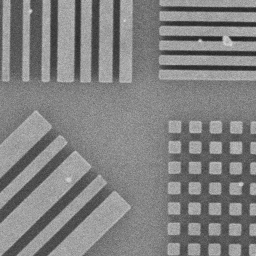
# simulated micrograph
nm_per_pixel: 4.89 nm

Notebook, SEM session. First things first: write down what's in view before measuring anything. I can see groups of lines, slits or small figures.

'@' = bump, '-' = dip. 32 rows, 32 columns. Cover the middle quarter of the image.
@@--@@@--@@@--@@@---------------
@@--@@@--@@@--@@@---------------
@@--@@@--@@@--@@@-------@@@@@@@@
@@--@@@--@@@--@@@-------@@@@@@@@
--------------------------------
--------------------------------
--------------------------------
--------------------------------
--------------------------------
--------------------------------
--------------------------------
--------------------------------
--------------------------------
--------------------------------
--------------------------@@@---
--------------------------@@@--@
--------------------------@@@--@
--------------------------------
--------------------------------
--------------------------@@@---
--------------------------@@@--@
--------------------------@@@--@
--@@----------------------------
-@@@@---------------------------
@@@@@@--------------------------
@@@@@@@-------------------@@@--@
@@@@@@--------------------@@@--@
@@@@@---------------------------
@@@@----@@----------------------
@@@----@@@----------------------
@@----@@@@----------------@@@--@
@----@@@@-----------------@@@--@